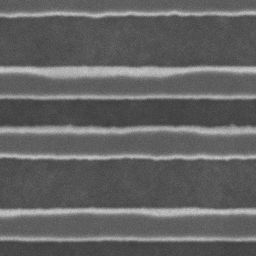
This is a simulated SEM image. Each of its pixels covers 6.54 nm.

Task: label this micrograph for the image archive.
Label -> lines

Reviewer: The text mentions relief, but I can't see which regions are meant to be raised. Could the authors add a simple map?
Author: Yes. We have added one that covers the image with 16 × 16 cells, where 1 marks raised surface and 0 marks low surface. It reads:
1111111111111111
0000000000000000
0000000000000000
0000000000000000
1111111111111111
1111111111111111
0000000000000000
0000000000000000
1111111111111111
1111111111111111
0000000000000000
0000000000000000
0000000000000000
1111111111111111
1111111111111111
0000000000000000